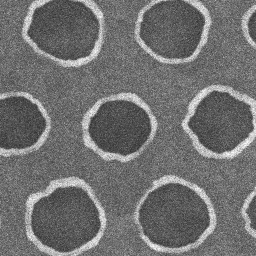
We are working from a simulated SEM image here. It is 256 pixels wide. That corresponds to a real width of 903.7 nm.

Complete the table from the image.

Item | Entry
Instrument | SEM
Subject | holes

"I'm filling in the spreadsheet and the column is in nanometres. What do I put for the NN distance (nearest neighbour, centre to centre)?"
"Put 362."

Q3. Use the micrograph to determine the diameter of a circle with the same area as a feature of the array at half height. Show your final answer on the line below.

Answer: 231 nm